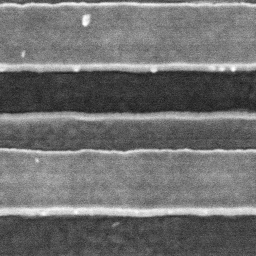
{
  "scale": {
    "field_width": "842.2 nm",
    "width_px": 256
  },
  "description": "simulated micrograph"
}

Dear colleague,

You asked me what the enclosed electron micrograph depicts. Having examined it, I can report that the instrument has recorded lines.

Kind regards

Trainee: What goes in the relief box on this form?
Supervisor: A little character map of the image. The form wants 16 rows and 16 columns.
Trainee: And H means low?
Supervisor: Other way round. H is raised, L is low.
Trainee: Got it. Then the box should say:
HHHHHHHHHHHHHHHH
HHHHHHHHHHHHHHHH
HHHHHHHHHHHHHHHH
HHHHHHHHHHHHHHHH
LLLLLLLLLLLLLLLL
LLLLLLLLLLLLLLLL
LLLLLLLLLLLLLLLL
HHHHHHHHHHHHHHHH
HHHHHHHHHHHHHHHH
HHHHHHHHHHHHHHHH
HHHHHHHHHHHHHHHH
HHHHHHHHHHHHHHHH
HHHHHHHHHHHHHHHH
LLLLLLLLLLLLLLLL
LLLLLLLLLLLLLLLL
LLLLLLLLLLLLLLLL